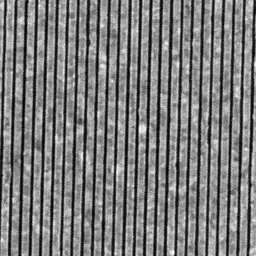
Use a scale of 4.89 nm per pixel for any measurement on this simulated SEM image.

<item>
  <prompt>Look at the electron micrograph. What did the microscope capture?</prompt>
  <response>parallel lines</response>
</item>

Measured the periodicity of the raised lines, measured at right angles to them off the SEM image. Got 0.0508 microns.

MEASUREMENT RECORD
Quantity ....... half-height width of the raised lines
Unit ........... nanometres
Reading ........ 29.4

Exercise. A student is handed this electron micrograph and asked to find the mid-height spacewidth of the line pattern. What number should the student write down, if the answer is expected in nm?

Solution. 20.8